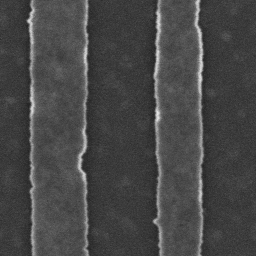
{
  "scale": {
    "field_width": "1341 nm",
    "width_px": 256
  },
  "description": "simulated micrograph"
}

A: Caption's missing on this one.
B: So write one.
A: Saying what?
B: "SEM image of one or a few lines or trenches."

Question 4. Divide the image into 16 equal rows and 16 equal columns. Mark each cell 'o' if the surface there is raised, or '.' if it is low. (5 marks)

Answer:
..ooo.....oo....
..ooo.....oo....
..ooo.....ooo...
..ooo.....ooo...
..ooo.....ooo...
..ooo.....ooo...
..ooo.....ooo...
..ooo.....ooo...
..ooo.....ooo...
..ooo.....ooo...
..ooo.....ooo...
..ooo.....ooo...
..ooo.....ooo...
..ooo.....ooo...
..ooo.....ooo...
..ooo.....ooo...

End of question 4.